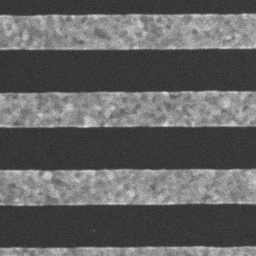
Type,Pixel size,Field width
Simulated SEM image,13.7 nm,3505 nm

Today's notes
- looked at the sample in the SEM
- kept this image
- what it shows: wiring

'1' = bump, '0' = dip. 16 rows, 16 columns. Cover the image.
0000000000000000
1111111111111111
1111111111111111
0000000000000000
0000000000000000
0000000000000000
1111111111111111
1111111111111111
0000000000000000
0000000000000000
0000000000000000
1111111111111111
1111111111111111
0000000000000000
0000000000000000
0000000001111111